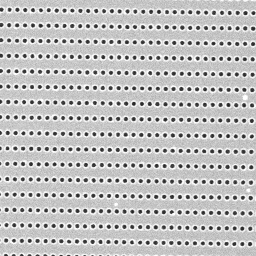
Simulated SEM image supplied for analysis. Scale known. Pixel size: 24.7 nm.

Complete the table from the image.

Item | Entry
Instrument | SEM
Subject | a regular array of holes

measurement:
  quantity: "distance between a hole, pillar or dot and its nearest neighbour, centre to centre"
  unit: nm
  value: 190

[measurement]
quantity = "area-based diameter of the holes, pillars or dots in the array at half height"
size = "118 nm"